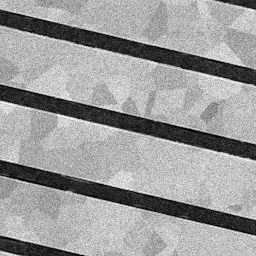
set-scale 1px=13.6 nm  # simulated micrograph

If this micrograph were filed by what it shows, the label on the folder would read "one or a few lines or trenches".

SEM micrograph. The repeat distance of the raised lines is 0.998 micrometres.